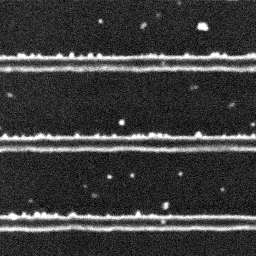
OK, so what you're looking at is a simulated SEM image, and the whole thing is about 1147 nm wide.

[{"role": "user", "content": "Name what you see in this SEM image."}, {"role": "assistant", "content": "lines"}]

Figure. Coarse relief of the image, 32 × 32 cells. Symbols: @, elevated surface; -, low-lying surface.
--------------------------------
--------------------------------
--------------------------------
--------------------------------
--------------------------------
--------------------------------
--------------------------------
@@@@@@@@@@@@@@@@@@@@@@@@@@@@@@@@
@@@@@@@@@@@@@@@@@@@@@@@@@@@@@@@@
--------------------------------
--------------------------------
--------------------------------
--------------------------------
--------------------------------
--------------------------------
--------------------------------
--------------------------------
@@@@@@@@@@@@@@@@@@@@@@@@@@@@@@@@
@@@@@@@@@@@@@@@@@@@@@@@@@@@@@@@@
--------------------------------
--------------------------------
--------------------------------
--------------------------------
--------------------------------
--------------------------------
--------------------------------
--------------------------------
@@@@@@@@@@@@@@@@@@@@@@@@@@@@@@@@
@@@@@@@@@@@@@@@@@@@@@@@@@@@@@@@@
--------------------------------
--------------------------------
--------------------------------